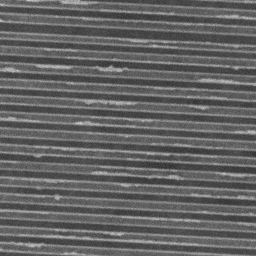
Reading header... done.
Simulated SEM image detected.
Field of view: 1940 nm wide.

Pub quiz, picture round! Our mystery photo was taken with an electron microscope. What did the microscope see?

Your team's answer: parallel lines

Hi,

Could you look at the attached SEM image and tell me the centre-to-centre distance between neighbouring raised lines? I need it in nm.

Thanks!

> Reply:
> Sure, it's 124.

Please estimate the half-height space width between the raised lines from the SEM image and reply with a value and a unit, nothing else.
57.7 nm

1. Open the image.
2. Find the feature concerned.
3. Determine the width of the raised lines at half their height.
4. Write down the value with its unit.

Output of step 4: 64.3 nanometres